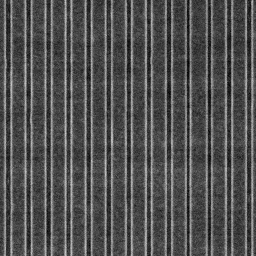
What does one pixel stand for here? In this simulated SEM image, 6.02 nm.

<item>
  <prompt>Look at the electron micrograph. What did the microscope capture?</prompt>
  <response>parallel lines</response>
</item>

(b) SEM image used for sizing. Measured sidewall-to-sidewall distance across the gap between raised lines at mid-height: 0.0278 microns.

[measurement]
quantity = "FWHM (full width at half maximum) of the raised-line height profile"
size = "94.1 nm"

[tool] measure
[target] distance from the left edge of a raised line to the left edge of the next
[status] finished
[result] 121 nanometers